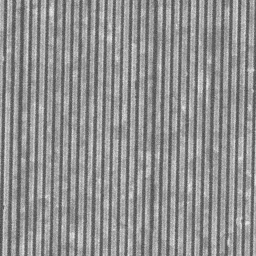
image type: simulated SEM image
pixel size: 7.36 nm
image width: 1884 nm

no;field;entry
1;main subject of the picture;parallel lines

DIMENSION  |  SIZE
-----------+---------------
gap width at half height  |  0.0331 um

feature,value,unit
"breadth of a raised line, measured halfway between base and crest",27.6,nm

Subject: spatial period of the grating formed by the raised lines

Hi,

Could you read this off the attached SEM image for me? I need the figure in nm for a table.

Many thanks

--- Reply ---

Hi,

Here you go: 61.4